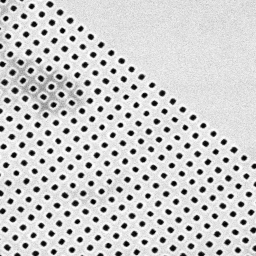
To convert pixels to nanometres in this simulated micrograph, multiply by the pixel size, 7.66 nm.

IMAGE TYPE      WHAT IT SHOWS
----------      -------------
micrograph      a regular array of holes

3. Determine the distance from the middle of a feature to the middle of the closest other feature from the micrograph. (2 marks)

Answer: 0.0962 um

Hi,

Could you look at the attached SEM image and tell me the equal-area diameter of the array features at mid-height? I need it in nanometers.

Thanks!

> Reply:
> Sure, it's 49.7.